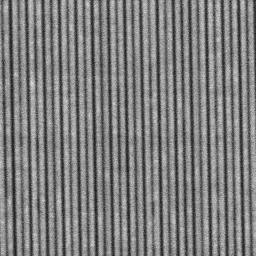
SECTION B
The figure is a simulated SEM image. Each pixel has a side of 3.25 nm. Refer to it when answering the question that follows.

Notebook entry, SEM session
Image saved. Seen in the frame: parallel lines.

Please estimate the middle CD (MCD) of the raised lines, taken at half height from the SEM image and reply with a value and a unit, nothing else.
19.1 nanometres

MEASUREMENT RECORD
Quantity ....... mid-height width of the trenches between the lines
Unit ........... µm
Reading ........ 0.0098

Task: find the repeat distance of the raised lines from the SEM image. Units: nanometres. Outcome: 26.6